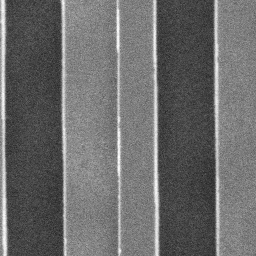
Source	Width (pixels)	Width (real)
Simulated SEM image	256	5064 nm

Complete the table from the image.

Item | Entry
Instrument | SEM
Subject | lines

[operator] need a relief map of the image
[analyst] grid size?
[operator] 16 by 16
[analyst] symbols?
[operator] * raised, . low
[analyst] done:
....******....**
....******....**
....******....**
....******....**
....******....**
....******....**
....******....**
....******....**
....******....**
....******....**
....******....**
....******....**
....******....**
....******....**
....******....**
....******....**